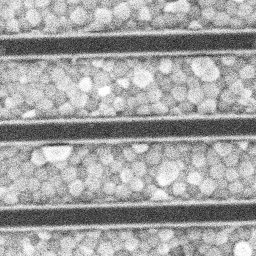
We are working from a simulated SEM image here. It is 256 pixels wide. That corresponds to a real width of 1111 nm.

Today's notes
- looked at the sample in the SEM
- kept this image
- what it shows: one or a few lines or trenches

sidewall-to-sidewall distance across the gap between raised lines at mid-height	63.3	pixels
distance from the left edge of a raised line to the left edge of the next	371	nm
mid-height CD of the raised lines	94.4	nanometers